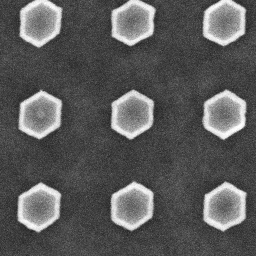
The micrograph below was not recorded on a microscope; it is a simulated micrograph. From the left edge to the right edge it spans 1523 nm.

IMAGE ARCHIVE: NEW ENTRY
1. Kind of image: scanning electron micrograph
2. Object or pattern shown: raised bodies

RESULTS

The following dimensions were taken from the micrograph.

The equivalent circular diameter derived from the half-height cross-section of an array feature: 40.5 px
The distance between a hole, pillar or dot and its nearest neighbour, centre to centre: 0.548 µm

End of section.